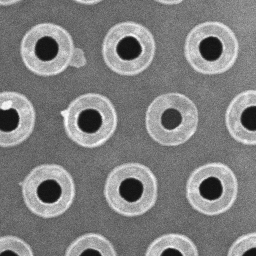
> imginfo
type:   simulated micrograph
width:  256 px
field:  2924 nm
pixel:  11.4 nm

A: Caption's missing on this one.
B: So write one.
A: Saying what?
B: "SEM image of ring-shaped raised bodies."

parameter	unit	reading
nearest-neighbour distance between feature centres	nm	926